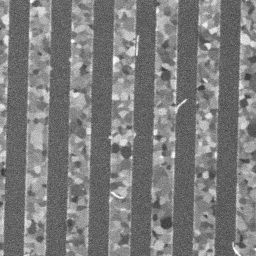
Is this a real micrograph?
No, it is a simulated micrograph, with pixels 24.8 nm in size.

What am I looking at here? parallel lines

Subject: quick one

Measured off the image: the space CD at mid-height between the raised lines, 536 nm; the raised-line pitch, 1050 nm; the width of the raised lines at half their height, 514 nm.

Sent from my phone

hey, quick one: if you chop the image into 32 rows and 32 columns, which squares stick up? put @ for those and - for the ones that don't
@---@@---@@@--@@@---@@---@@---@@
@---@@---@@@--@@@---@@---@@---@@
@---@@---@@@--@@@---@@---@@---@@
@---@@---@@@--@@@---@@---@@---@@
@---@@---@@@--@@@---@@---@@---@@
@---@@---@@---@@@---@@---@@---@@
@---@@---@@---@@@---@@---@@---@@
@---@@---@@---@@@---@@---@@---@@
@---@@---@@---@@@--@@@---@@---@@
@---@@---@@---@@@--@@@---@@---@@
@---@@---@@---@@@--@@@---@@---@@
@---@@---@@---@@@--@@@---@@---@@
@---@@---@@---@@@--@@@---@@---@@
@---@@---@@---@@@--@@@---@@---@@
@---@@---@@---@@@--@@@---@@---@@
@---@@---@@---@@@--@@@---@@---@@
@--@@@---@@---@@@--@@@---@@---@@
@--@@@---@@---@@@--@@@---@@---@@
@--@@@---@@---@@---@@@---@@---@@
@--@@@---@@---@@---@@@---@@---@@
@--@@@---@@---@@---@@@--@@@---@@
@--@@@---@@---@@---@@@--@@@---@@
@--@@@---@@---@@---@@@--@@@---@@
---@@@---@@---@@---@@@--@@@---@@
---@@@---@@---@@---@@@--@@@---@@
---@@@---@@---@@---@@@--@@@---@@
---@@@--@@@---@@---@@@--@@@---@@
---@@@--@@@---@@---@@@--@@@---@@
---@@@--@@@---@@---@@---@@@---@@
---@@@--@@@---@@---@@---@@@---@@
---@@@--@@@---@@---@@---@@@--@@@
---@@@--@@@---@@---@@---@@@--@@@